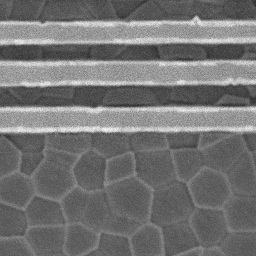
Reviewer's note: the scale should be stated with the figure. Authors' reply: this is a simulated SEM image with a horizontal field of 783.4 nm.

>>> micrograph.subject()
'parallel lines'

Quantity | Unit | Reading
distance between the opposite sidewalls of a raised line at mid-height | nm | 68.8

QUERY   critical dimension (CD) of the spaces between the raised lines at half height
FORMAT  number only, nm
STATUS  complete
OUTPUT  61.7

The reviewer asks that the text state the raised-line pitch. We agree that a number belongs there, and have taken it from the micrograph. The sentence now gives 0.133 micrometres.